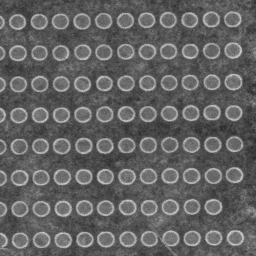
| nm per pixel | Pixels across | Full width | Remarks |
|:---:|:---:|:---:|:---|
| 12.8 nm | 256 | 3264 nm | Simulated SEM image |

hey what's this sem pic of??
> a regular array of raised bodies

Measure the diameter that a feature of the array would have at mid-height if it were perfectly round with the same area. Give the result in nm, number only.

194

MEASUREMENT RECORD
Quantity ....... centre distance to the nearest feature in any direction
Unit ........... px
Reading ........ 21.2